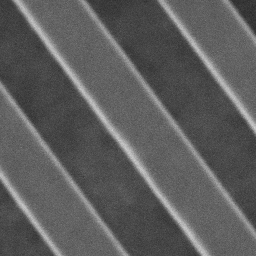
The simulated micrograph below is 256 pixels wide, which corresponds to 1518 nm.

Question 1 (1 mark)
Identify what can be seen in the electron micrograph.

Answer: lines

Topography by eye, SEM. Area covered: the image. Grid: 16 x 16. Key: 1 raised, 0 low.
0111110000111110
0011110000011110
0001111000001111
0001111100001111
0000111110000111
0000011110000011
1000001111000001
1100001111100001
1100000111110000
1110000011110000
1111000001111000
1111100001111100
0111100000111100
0011110000011110
0011111000001111
0001111100001111